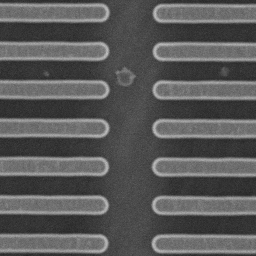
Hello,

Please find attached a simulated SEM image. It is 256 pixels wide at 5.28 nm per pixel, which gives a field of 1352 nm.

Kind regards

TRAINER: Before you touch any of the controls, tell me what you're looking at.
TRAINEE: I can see groups of lines, slits or small figures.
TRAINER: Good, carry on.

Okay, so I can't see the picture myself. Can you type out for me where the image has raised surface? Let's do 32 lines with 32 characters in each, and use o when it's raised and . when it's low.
................................
ooooooooooooo......ooooooooooooo
ooooooooooooo.......oooooooooooo
................................
................................
ooooooooooooo.......oooooooooooo
ooooooooooooo......ooooooooooooo
...........................ooo.o
................................
................................
ooooooooooooo.......oooooooooooo
ooooooooooooo......ooooooooooooo
................................
................................
................................
ooooooooooooo......ooooooooooooo
ooooooooooooo......ooooooooooooo
................................
................................
................................
ooooooooooooo......ooooooooooooo
ooooooooooooo......ooooooooooooo
................................
................................
................................
ooooooooooooo......ooooooooooooo
ooooooooooooo.......oooooooooooo
................................
................................
ooooooooooooo.......ooooooooo...
ooooooooooooo......ooooooooooooo
..........ooo.......oooooooooooo